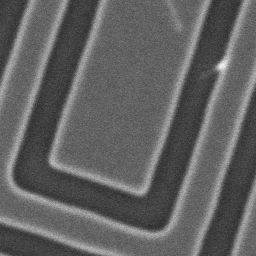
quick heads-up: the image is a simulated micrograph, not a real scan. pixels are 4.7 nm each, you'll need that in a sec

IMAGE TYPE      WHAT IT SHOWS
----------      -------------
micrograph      groups of lines, slits or small figures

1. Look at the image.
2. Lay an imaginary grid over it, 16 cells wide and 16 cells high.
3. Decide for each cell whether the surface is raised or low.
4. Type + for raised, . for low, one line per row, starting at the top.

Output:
..++..+++++++..+
.+++..+++++++..+
.++...++++++..++
.++..+++++++..++
+++..+++++++..++
++...++++++..+++
++..+++++++..++.
++..+++++++..++.
+...++++++...++.
+..+++++++..++..
+...++++++..++..
+......++..+++..
+++........++...
++++++.....++..+
..+++++++.+++..+
.....+++++++...+